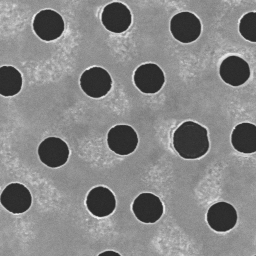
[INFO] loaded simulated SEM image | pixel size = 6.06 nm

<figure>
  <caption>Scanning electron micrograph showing a regular array of holes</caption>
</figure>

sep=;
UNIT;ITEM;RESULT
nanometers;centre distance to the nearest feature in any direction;391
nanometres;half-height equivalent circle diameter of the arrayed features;185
